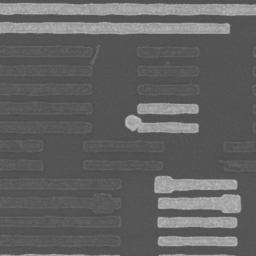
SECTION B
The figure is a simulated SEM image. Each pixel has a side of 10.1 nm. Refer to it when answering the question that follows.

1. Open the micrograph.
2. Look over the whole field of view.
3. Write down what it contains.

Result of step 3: wiring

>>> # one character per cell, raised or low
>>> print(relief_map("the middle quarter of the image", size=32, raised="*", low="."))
................................
*******............*************
*******............*************
................................
................................
*******............*************
*******............*************
..***...............****....****
................................
................................
*******............*************
*******............*************
................................
................**..............
...............****.............
*******.........****************
*******............*************
................................
................................
.....********....****...........
.....********************.......
.....********************.......
................................
................................
.....*******...****...*.........
.....********************.......
.....................**.........
................................
.......................****.....
**************.........*********
**************.........*********
.......................*****....